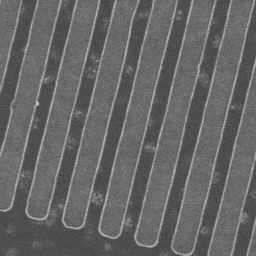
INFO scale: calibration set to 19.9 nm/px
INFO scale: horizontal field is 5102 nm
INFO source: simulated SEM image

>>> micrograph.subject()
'parallel lines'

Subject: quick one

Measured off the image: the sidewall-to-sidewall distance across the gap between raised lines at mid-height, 428 nm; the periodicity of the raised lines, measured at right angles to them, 751 nanometers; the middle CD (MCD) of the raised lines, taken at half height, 312 nanometres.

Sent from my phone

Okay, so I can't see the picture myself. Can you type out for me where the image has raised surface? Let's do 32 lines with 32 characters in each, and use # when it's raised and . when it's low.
...##..###..##...##...##...##...
..##...##...##...##...##...##..#
..##...##...##...##...##..##...#
..##...##...##..##...##...##...#
..##..###..##...##...##...##...#
.##...##...##...##...##...##...#
.##...##...##...##...##..##...##
.##...##...##...#...##...##...##
.##...##..##...##...##...##...##
##...##...##...##...##...##...##
##...##...##...##..###..##...##.
##...##...##...##..##...##...##.
##...##..##...##...##...##...##.
#...##...##...##...##...##...##.
#...##...##...##...##..##...##..
#...##...##..###..##...##...##..
#...##..##...##...##...##...##..
#..##...##...##...##...##...##..
...##...##...##...##..###..##...
...##...##...##..##...##...##...
...##...#...##...##...##...##...
..##...##...##...##...##...##..#
..##...##...##...##...#...##...#
..##...##...##..##...##...##...#
..##...##..##...##...##...##...#
.##...##...##...##...##...##..##
###...##...##...##..###..##...##
########...##..##...##...##...##
#########.##...##...##...##...##
#############..##...##...##..###
#################..###..##...##.
######################..##...##.